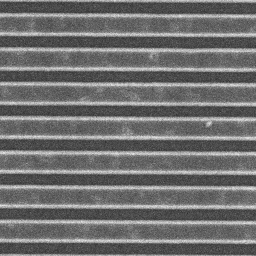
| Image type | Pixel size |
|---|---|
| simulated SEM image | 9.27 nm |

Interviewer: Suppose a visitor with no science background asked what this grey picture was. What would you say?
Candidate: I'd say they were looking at parallel lines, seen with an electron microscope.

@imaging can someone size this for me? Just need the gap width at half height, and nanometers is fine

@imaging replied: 129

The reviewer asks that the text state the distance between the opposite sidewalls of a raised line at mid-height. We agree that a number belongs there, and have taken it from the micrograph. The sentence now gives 190 nanometers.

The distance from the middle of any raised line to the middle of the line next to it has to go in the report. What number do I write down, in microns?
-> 0.319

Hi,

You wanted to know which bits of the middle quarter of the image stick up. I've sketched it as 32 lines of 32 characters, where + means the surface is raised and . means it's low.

++++++++++++++++++++++++++++++++
................................
................................
................................
................................
++++++++++++++++++++++++++++++++
++++++++++++++++++++++++++++++++
++++++++++++++++++++++++++++++++
++++++++++++++++++++++++++++++++
++++++++++++++++++++++++++++++++
................................
................................
................................
+++++++++++++++++...............
++++++++++++++++++++++++++++++++
++++++++++++++++++++++++++++++++
++++++++++++++++++++++++++++++++
++++++++++++++++++++++++++++++++
++++++++++++++++++++++++++++++++
................................
................................
................................
++++++++++++++++++++++++++++++++
++++++++++++++++++++++++++++++++
++++++++++++++++++++++++++++++++
++++++++++++++++++++++++++++++++
++++++++++++++++++++++++++++++++
................................
................................
................................
................................
++++++++++++++++++++++++++++++++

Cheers